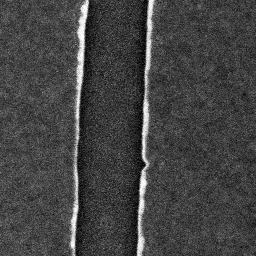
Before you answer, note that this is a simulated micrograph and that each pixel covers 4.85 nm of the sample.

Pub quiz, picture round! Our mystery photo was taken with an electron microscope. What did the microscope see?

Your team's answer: one or a few lines or trenches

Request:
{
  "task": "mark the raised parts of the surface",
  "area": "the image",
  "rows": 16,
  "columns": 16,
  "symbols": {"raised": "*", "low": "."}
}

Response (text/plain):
*****....*******
*****....*******
*****....*******
*****....*******
*****....*******
*****....*******
*****....*******
*****....*******
*****....*******
*****....*******
*****....*******
*****....*******
*****....*******
*****....*******
*****....*******
*****....*******